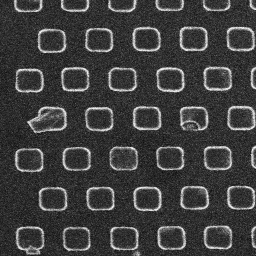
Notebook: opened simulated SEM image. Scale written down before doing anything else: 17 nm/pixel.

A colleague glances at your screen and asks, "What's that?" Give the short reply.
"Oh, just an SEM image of a regular array of raised bodies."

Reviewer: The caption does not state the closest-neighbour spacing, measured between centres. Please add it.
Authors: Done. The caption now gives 780 nm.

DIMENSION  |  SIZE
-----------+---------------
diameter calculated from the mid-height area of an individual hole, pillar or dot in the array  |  452 nanometers